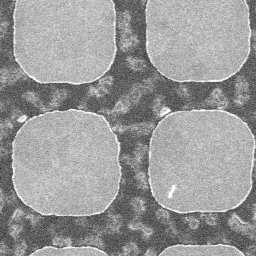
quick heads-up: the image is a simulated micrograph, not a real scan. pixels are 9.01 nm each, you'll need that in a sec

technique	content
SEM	raised bodies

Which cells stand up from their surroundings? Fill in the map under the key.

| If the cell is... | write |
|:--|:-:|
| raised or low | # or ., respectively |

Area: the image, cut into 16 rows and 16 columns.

.######..######.
.######..#######
.######..#######
.######..######.
..#####...#####.
................
................
..#####...#####.
.######...######
.######..#######
.######..#######
.######..#######
.######...#####.
................
................
...###.....####.